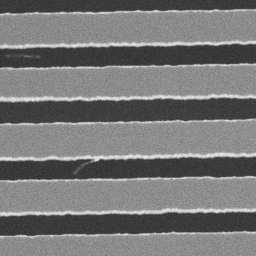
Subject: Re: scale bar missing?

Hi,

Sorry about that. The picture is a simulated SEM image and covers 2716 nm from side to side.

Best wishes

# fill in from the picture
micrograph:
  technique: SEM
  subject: lines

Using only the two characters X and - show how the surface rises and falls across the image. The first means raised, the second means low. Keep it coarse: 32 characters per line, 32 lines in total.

--------------------------------
--------------XXXXXXXXXXXXXXXXXX
XXXXXXXXXXXXXXXXXXXXXXXXXXXXXXXX
XXXXXXXXXXXXXXXXXXXXXXXXXXXXXXXX
XXXXXXXXXXXXXXXXXXXXXXXXXXXXXXXX
XXXXXXXXXXXXXXXXXXXXXXXXXXXXX-X-
--------------------------------
--------------------------------
------XXXXXXXXXXXXXXXXXXXXXXXXXX
XXXXXXXXXXXXXXXXXXXXXXXXXXXXXXXX
XXXXXXXXXXXXXXXXXXXXXXXXXXXXXXXX
XXXXXXXXXXXXXXXXXXXXXXXXXXXXXXXX
XXXXXXXXXXXX--------------------
--------------------------------
--------------------------------
XXXXXXXXXXXXXXXXXXXXXXXXXXXXXXXX
XXXXXXXXXXXXXXXXXXXXXXXXXXXXXXXX
XXXXXXXXXXXXXXXXXXXXXXXXXXXXXXXX
XXXXXXXXXXXXXXXXXXXXXXXXXXXXXXXX
XXXXXXXXXXXXXXXXXXXXXXXXXXXXXXXX
--------------------------------
--------------------------------
---------X-XXXXXXXXXXXXXXXXXXXXX
XXXXXXXXXXXXXXXXXXXXXXXXXXXXXXXX
XXXXXXXXXXXXXXXXXXXXXXXXXXXXXXXX
XXXXXXXXXXXXXXXXXXXXXXXXXXXXXXXX
XXXXXXXXXXXXXXXXXXXXX-XXXXXX----
--------------------------------
--------------------------------
--XXXXXXXXXXXXXXXXXXXXXXXXXXXXXX
XXXXXXXXXXXXXXXXXXXXXXXXXXXXXXXX
XXXXXXXXXXXXXXXXXXXXXXXXXXXXXXXX